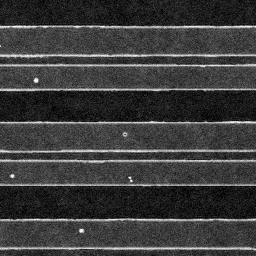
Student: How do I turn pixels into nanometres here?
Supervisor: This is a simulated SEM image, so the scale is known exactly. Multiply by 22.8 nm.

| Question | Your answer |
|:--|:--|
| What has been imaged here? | lines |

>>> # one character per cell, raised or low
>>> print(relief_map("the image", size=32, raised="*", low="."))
................................
................................
................................
********************************
********************************
********************************
********************************
********************************
********************************
********************************
********************************
................................
................................
................................
................................
********************************
********************************
********************************
********************************
********************************
********************************
********************************
********************************
................................
................................
................................
................................
....*.........****........**....
********************************
********************************
********************************
********************************